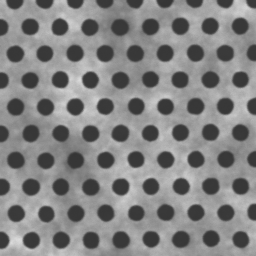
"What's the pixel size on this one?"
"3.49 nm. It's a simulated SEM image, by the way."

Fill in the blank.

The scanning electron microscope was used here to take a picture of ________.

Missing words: a regular array of holes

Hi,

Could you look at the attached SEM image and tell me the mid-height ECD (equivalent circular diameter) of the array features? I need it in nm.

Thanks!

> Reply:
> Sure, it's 58.4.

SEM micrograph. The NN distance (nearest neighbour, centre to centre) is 104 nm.